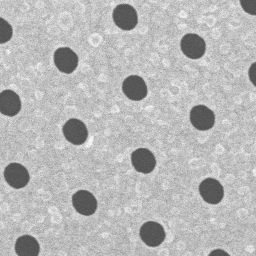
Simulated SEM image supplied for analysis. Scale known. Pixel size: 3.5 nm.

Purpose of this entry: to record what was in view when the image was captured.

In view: a regular array of holes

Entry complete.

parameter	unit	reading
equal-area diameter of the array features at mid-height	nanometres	90.2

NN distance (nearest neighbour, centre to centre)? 253 nm